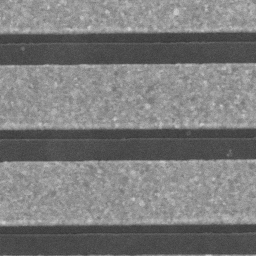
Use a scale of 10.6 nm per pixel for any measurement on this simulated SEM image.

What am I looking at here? lines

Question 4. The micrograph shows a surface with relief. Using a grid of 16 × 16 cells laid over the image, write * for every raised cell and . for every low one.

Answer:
****************
****************
................
................
****************
****************
****************
****************
................
................
****************
****************
****************
****************
................
................